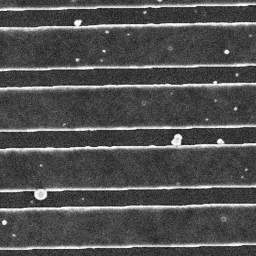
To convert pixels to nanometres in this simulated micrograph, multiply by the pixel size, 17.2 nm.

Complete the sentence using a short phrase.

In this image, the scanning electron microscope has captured lines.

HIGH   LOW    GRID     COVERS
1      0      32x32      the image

11111111111111111111111111111111
00000000000000000000000000000000
00000000000000000000000000000000
11001111111111111111111111111111
11111111111111111111111111111111
11111111111111111111111111111111
11111111111111111111111111111111
11111111111111111111111111111111
11111111111000000000000000000000
00000000000000000000000000000000
00000000000000000000000000000111
11111111111111111111111111111111
11111111111111111111111111111111
11111111111111111111111111111111
11111111111111111111111111111111
11111111111111111111111111111111
00000000000000000000000000000000
00000000000000000000001000000000
00000000011111111111111111111111
11111111111111111111111111111111
11111111111111111111111111111111
11111111111111111111111111111111
11111111111111111111111111111111
11111111111111111111110000000000
00001100000000000000000000000000
00000000000000000000000000000000
11111111111111111111111111111111
11111111111111111111111111111111
11111111111111111111111111111111
11111111111111111111111111111111
11111111111111111111111111111111
00000000000000000000000000000000